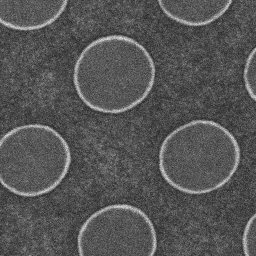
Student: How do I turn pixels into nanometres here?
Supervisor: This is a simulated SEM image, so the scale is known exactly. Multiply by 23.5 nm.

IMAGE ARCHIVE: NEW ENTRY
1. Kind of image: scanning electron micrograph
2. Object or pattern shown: raised bodies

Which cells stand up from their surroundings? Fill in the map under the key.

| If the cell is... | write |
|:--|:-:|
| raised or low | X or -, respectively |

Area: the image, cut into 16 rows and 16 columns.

XXXX------XXXX--
XXX---------X---
------XX--------
-----XXXX-------
-----XXXXX-----X
-----XXXX------X
------XX--------
----------------
XXXX-------XXX--
XXXX------XXXXX-
XXXX------XXXXX-
XXXX-------XXX--
----------------
------XXX-------
-----XXXXX-----X
-----XXXXX-----X